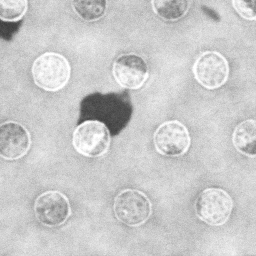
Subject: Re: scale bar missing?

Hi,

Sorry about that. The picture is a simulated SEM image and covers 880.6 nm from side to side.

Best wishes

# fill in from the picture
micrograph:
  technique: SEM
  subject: a regular array of raised bodies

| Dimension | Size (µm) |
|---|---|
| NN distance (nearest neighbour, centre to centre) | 0.272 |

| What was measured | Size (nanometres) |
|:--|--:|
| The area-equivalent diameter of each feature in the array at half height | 119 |